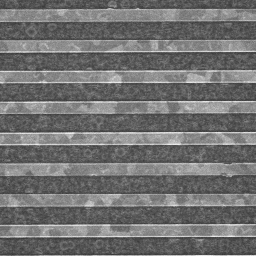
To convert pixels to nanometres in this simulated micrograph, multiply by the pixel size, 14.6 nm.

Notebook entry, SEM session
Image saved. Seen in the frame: parallel lines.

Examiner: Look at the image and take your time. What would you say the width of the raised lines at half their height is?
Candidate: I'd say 0.174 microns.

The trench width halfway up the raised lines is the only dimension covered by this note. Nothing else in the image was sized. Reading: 19.1 pixels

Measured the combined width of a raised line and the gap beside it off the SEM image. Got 30.8 pixels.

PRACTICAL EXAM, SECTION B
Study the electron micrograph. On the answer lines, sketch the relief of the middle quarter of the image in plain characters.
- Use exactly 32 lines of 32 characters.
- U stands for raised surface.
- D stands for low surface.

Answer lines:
DDDDDDDDDDDDDDDDDDDDDDDDDDDDDDDD
DDDDDDDDDDDDDDDDDDDDDDDDDDDDDDDD
UUUUUUUUUUUUUUUUUUUUUUUUUUUUUUUU
UUUUUUUUUUUUUUUUUUUUUUUUUUUUUUUU
DDDDDDDDDDDDDDDDDDDDDDDDDDDDDDDD
DDDDDDDDDDDDDDDDDDDDDDDDDDDDDDDD
DDDDDDDDDDDDDDDDDDDDDDDDDDDDDDDD
DDDDDDDDDDDDDDDDDDDDDDDDDDDDDDDD
DDDDDDDDDDDDDDDDDDDDDDDDDDDDDDDD
DDDDDDDUUUUUUUUUUUUUUUUUUUUUUUUU
UUUUUUUUUUUUUUUUUUUUUUUUUUUUUUUU
UUUUUUUUUUUUUUUUUUUUUUUUUUUUUUUU
DDDDDDDDDDDDDDDDDDDDDDDDDDDDDDDD
DDDDDDDDUDDDDDDDDDDDDDDDDDDDDDDD
DDDDDDDDDDDDDDDDDDDDDDDDDDDDDDDD
DDDDDDDDDDDDDDDDDDDDDDDDDDDDDDDD
DDDDDDDDDDDDDDDDDDDDDDDDDDDDDDDD
UUUUUUUUUUUUUUUUUUUUUUUUUUUUUUUU
UUUUUUUUUUUUUUUUUUUUUUUUUUUUUUUU
UUUUUUUUUUUUUUUUUUUUUUUUUUUUUUUU
DDDDDDDDDDDDDDDDDDDDDDDDDDDDDDDD
DDDDDDDDDDDDDDUDDDDDDDDDDDDDDDDD
DDDDDDDDDDDDDUUDDDDDDDDDDDDDDDDD
DDDDDDDDDDDDDDDDDDDDDDDDDDDDDDDD
DDDDDDDDDDDDDDDDDDDDDDDDDDDDDDDD
UUUUUUUUUUUUUUUUUUUUUUUUUUUUUUUU
UUUUUUUUUUUUUUUUUUUUUUUUUUUUUUUU
UUUUUUUUUUUUUUUUUUUUUUUUUUUUUUUU
DDDDDDDDDDDDDDDDDDDDDDDDDDDDDDDD
DDDDDDDDDDDDDDDDDDDDDDDDDDDDDDDD
DDDDDDDDDDDDDDDDDDDDDDDDDDDDDDDD
DDDDDDDDDDDDDDDDDDDDDDDDDDDDDDDD